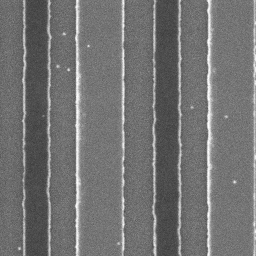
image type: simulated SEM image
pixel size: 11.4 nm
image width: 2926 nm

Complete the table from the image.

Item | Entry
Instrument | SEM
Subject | lines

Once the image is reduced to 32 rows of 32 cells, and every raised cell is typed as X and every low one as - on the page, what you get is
---XXX----XXXXX----XXXX---XXXXXX
---XXX----XXXXX----XXXX---XXXXXX
---XXX----XXXXX----XXXX---XXXXXX
---XXX----XXXXX----XXXX---XXXXXX
---XXX----XXXXX----XXXX---XXXXXX
---XXX----XXXXX----XXXX---XXXXXX
---XXX----XXXXX----XXXX---XXXXXX
---XXX----XXXXX----XXXX---XXXXXX
---XXX----XXXXX----XXXX---XXXXXX
---XXX----XXXXX----XXXX---XXXXXX
---XXX----XXXXX----XXXX---XXXXXX
---XXX----XXXXX----XXXX---XXXXXX
---XXX----XXXXX----XXXX---XXXXXX
---XXX----XXXXX----XXXX---XXXXXX
---XXX----XXXXX----XXXX---XXXXXX
---XXX----XXXXX----XXXX---XXXXXX
---XXX----XXXXX----XXXX---XXXXXX
---XXX----XXXXX----XXXX---XXXXXX
---XXX----XXXXX----XXXX---XXXXXX
---XXX----XXXXX----XXXX---XXXXXX
---XXX----XXXXX----XXXX---XXXXXX
---XXX----XXXXX----XXXX---XXXXXX
---XXX----XXXXX----XXXX---XXXXXX
---XXX----XXXXX----XXXX---XXXXXX
---XXX----XXXXX----XXXX---XXXXXX
---XXX----XXXXX----XXXX---XXXXXX
---XXX----XXXXX----XXXX---XXXXXX
---XXX----XXXXX----XXXX---XXXXXX
---XXX----XXXXX----XXXX---XXXXXX
---XXX----XXXXX----XXXX---XXXXXX
---XXX----XXXXX----XXXX---XXXXXX
---XXX----XXXXX----XXXX---XXXXXX